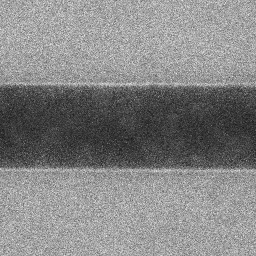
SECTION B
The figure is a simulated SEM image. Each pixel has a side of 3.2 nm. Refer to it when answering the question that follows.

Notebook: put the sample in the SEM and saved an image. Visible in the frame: one or a few lines or trenches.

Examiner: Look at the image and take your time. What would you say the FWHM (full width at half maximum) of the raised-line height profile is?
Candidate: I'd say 281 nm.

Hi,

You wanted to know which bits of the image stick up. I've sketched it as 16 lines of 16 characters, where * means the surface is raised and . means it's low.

................
................
................
................
................
****************
****************
****************
****************
****************
****************
................
................
................
................
................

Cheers